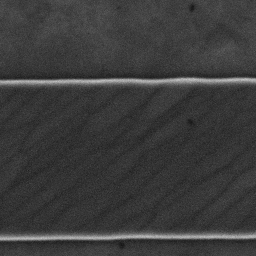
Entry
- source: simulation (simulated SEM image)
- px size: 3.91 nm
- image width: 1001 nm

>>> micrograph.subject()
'wiring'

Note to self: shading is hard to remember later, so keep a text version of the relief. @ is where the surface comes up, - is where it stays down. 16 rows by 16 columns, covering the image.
----------------
----------------
----------------
----------------
----------------
@@@@@@@@@@@@@@@@
@@@@@@@@@@@@@@@@
@@@@@@@@@@@@@@@@
@@@@@@@@@@@@@@@@
@@@@@@@@@@@@@@@@
@@@@@@@@@@@@@@@@
@@@@@@@@@@@@@@@@
@@@@@@@@@@@@@@@@
@@@@@@@@@@@@@@@@
@@@@@@@@@@@@@@@@
----------------